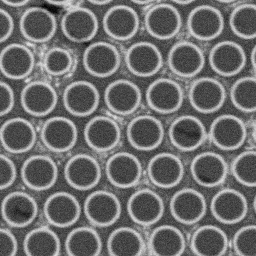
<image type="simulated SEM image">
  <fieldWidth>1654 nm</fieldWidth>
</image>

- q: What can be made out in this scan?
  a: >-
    a regular array of raised bodies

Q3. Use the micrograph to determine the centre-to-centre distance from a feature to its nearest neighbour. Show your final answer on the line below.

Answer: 41.2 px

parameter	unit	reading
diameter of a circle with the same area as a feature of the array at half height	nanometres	214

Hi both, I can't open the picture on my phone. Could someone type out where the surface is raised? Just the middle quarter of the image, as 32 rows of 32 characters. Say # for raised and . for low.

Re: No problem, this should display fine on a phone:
#....########...########...#####
#.....#######....######....#####
........###.......####.......###
................................
..............#........####.....
..#####.....######....######....
.#######...#######...########...
########...########..########...
########...########..########...
########...########..########...
.#######...#######....#######...
.######.....#####......####.....
...###..........................
........##........####........##
##.....#####.....######.....####
##....#######....#######...#####
###..#########..########...#####
###..#########..########...#####
###..#########..########...#####
##....#######....#######...#####
##.....#####......#####.....####
................................
................................
..####......######.....#####....
.#######...#######....#######...
.#######...########..########...
.########..########..########...
.########..########..########...
.########..########...#######...
.#######....######.....#####....
..#####.......##................
................................